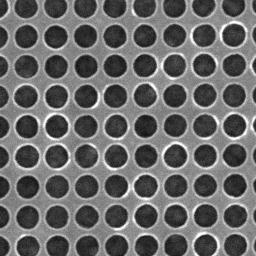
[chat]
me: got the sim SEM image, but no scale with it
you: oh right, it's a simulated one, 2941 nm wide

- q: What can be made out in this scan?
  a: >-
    a regular array of holes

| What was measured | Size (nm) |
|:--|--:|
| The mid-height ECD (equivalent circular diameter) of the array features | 277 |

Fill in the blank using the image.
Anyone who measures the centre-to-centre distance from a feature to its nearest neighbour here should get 29.5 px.